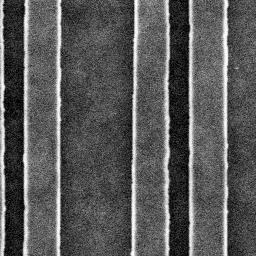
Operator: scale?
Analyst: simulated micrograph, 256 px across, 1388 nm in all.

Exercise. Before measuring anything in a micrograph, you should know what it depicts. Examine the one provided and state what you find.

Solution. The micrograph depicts lines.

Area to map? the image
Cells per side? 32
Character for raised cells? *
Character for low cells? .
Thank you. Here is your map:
...****..........****...****....
...*****.........****...****....
...****..........****...****....
...****..........****...****....
...*****.........****...****....
...*****.........****...****....
...****..........****...****....
...****..........****...****....
...****..........****...****....
...*****.........****...****....
...****..........****...****....
...****..........****...****....
...****..........****...****....
...****..........****...****....
...****..........****...****....
...****..........****...****....
...****..........****...****....
...****..........****...****....
...****..........****...****....
...****..........****...****....
...****..........****...****....
...****..........****...****....
...****..........****...****....
...****..........****...****....
...****..........****...****....
*..****..........****...****....
*..****..........****...****....
...****..........****...****....
...****..........****...****....
...****..........****...****....
...****..........****...****....
...****..........****...****....